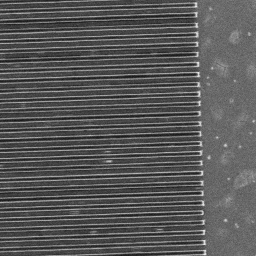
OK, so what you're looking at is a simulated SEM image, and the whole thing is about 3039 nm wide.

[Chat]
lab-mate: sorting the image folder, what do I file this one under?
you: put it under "parallel lines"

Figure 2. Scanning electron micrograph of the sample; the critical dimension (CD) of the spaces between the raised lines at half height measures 0.0652 microns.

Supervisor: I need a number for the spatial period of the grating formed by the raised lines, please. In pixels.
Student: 9.91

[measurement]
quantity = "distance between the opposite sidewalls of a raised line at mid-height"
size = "0.0549 microns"